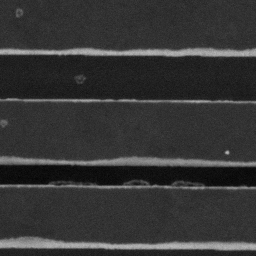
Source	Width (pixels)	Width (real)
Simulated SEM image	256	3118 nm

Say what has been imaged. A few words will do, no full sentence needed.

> lines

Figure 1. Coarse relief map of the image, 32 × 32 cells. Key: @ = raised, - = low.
@@@@@@@@@@@@@@@@@@@@@@@@@@@@@@@@
@@@@@@@@@@@@@@@@@@@@@@@@@@@@@@@@
@@@@@@@@@@@@@@@@@@@@@@@@@@@@@@@@
@@@@@@@@@@@@@@@@@@@@@@@@@@@@@@@@
@@@@@@@@@@@@@@@@@@@@@@@@@@@@@@@@
@@@@@@@@@@@@@@@@@@@@@@@@@@@@@@@@
@@@@@@@@@@@@@@@@@@@@@@@@@@@@@@@@
--------------------------------
--------------------------------
--------------------------------
--------------------------------
--------------------------------
@@------------------------------
@@@@@@@@@@@@@@@@@@@@@@@@@@@@@@@@
@@@@@@@@@@@@@@@@@@@@@@@@@@@@@@@@
@@@@@@@@@@@@@@@@@@@@@@@@@@@@@@@@
@@@@@@@@@@@@@@@@@@@@@@@@@@@@@@@@
@@@@@@@@@@@@@@@@@@@@@@@@@@@@@@@@
@@@@@@@@@@@@@@@@@@@@@@@@@@@@@@@@
@@@@@@@@@@@@@@@@@@@@@@@@@@@@@@@@
----------@@@---------@@@@@@@@@@
--------------------------------
--------------------------------
@@@@@@@@@@@@@@@@@@@@@@@@@@@@@@@@
@@@@@@@@@@@@@@@@@@@@@@@@@@@@@@@@
@@@@@@@@@@@@@@@@@@@@@@@@@@@@@@@@
@@@@@@@@@@@@@@@@@@@@@@@@@@@@@@@@
@@@@@@@@@@@@@@@@@@@@@@@@@@@@@@@@
@@@@@@@@@@@@@@@@@@@@@@@@@@@@@@@@
@@@@@@@@@@@@@@@@@@@@@@@@@@@@@@@@
@@@-@@@@@@@@@@@@@@@@@@@@@@@@@@@@
--------------------------------